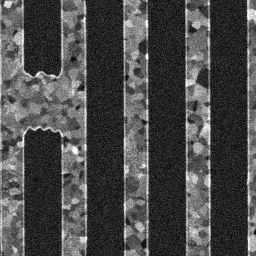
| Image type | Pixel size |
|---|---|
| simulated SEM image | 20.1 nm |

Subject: parallel lines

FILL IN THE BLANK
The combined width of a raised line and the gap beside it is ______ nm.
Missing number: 1240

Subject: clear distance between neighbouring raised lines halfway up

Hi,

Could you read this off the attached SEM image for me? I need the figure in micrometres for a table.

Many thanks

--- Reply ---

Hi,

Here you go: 0.782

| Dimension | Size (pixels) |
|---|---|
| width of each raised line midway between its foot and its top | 23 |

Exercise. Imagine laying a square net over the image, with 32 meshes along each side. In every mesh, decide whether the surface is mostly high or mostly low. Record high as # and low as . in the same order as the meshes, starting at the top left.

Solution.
###.....###.....##.....###.....#
###.....###.....##.....###.....#
###.....###.....##.....###.....#
###.....###.....##.....###.....#
###.....###.....##.....###.....#
###.....###.....##.....###.....#
###.....###.....##.....###.....#
###.....###.....##.....###.....#
###.....###.....##.....###.....#
######.####.....##.....###.....#
###########.....##.....###.....#
###########.....##.....###.....#
###########.....##.....###.....#
###########.....##.....###.....#
###########.....##.....###.....#
###########.....##.....###.....#
###....####.....##.....###.....#
###.....###.....##.....###.....#
###.....###.....##.....###.....#
###.....###.....##.....###.....#
###.....###.....##.....###.....#
###.....###.....##.....###.....#
###.....###.....##.....###.....#
###.....###.....##.....###.....#
###.....###.....##.....###.....#
###.....###.....##.....###.....#
###.....###.....##.....###.....#
###.....###.....##.....###.....#
###.....###.....##.....###.....#
###.....###.....##.....###.....#
###.....###.....##.....###.....#
###.....###.....##.....###.....#